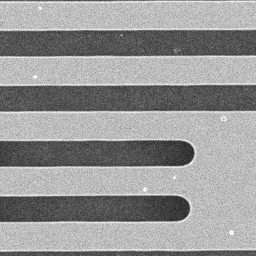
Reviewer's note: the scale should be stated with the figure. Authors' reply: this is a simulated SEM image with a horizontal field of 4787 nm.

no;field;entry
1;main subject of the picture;groups of lines, slits or small figures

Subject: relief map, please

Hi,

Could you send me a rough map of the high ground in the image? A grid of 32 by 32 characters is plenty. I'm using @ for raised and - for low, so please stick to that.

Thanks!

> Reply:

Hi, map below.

@@@@@@@@@@@@@@@@@@@@@@@@@@@@@@@@
@@@@@@@@@@@@@@@@@@@@@@@@@@@@@@@@
@@@@@@@@@@@@@@@@@@@@@@@@@@@@@@@@
@@@@@@@@@@@@@@@@@@@@@@@@@@@@@@@@
--------------------------------
--------------------------------
--------------------------------
@@@@@@@@@@@@@@@@@@@@@@@@@@@@@@@@
@@@@@@@@@@@@@@@@@@@@@@@@@@@@@@@@
@@@@@@@@@@@@@@@@@@@@@@@@@@@@@@@@
@@@@@@@@@@@@@@@@@@@@@@@@@@@@@@@@
--------------------------------
--------------------------------
--------------------------------
@@@@@@@@@@@@@@@@@@@@@@@@@@@@@@@@
@@@@@@@@@@@@@@@@@@@@@@@@@@@@@@@@
@@@@@@@@@@@@@@@@@@@@@@@@@@@@@@@@
@@@@@@@@-@------------@@@@@@@@@@
------------------------@@@@@@@@
------------------------@@@@@@@@
-----------------------@@@@@@@@@
@@@@@@@@@@@@@@@@@@@@@@@@@@@@@@@@
@@@@@@@@@@@@@@@@@@@@@@@@@@@@@@@@
@@@@@@@@@@@@@@@@@@@@@@@@@@@@@@@@
@@--------------------@@@@@@@@@@
------------------------@@@@@@@@
------------------------@@@@@@@@
-----------------------@@@@@@@@@
@@@@@@@@@@@@@@@@@@@@@@@@@@@@@@@@
@@@@@@@@@@@@@@@@@@@@@@@@@@@@@@@@
@@@@@@@@@@@@@@@@@@@@@@@@@@@@@@@@
--------------------------------